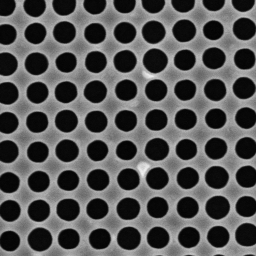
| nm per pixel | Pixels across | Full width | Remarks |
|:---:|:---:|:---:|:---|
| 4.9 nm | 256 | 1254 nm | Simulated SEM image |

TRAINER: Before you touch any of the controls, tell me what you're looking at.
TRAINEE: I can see a regular array of holes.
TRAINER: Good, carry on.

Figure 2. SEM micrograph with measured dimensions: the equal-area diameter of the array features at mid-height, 106 nm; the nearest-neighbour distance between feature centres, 142 nm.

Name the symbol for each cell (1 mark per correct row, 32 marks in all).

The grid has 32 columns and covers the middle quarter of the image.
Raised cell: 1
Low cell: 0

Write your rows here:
00011000001110000011000000110000
00111100001110000111100001111101
11111111111111111111111111111111
11111111111111111111111111111111
01111100011111000111100001111000
00011000001110000011000000110000
00011000000110000011000000100000
00011000000110000011000000110000
00011100001111000111100001111000
00111110011111111111111111111111
11111111111111111111111111111111
01111111111111101111110011111000
00011100001110000011100001110000
00011000000110000011000000110000
00001000000110000011000000110000
00011000000110000011100001110000
00111100001111000111110011111101
11111111111111111111111111111111
11111111111111111111111011111111
00111110001111000111100000111000
00011100000110000011000000110000
00001100000110000011000000110000
00001100000110000011000000110000
00011110001111000111100001111000
01111111111111111111111111111111
11111111111111111111111111111111
11111111001111100011110001111000
00011100000111000011100000110000
00011100000110000001000000110000
00001100000110000001100000110000
00011100000111000011100001111000
00111111001111110111111111111111